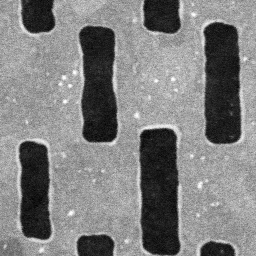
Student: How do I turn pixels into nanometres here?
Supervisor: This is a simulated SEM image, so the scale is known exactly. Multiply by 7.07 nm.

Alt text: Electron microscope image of holes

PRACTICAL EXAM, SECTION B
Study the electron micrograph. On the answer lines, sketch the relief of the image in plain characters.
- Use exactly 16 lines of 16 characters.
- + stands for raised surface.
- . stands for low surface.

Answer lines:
+..++++++..+++++
+..++++++..++.++
+++++..++++++..+
+++++..++++++..+
+++++..++++++..+
+++++..++++++..+
+++++..++++++..+
+++++..++++++..+
+++++..++..++..+
+..++++++..+++++
+..++++++..+++++
+..++++++..+++++
+..++++++..+++++
+..++++++..+++++
+..++++++..+++++
+++++..++..++..+